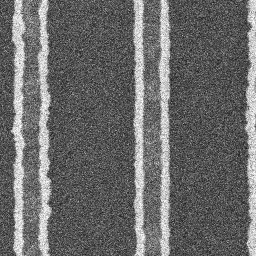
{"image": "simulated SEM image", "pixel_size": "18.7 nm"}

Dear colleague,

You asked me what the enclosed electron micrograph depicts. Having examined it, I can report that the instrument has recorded one or a few lines or trenches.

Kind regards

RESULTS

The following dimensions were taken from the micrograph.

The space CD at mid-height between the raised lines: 1720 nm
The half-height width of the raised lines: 475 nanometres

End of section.